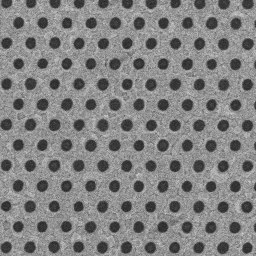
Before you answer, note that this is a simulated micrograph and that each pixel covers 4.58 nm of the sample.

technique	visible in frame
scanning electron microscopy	a regular array of holes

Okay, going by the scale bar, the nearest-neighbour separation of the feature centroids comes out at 107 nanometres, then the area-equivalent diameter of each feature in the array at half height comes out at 11.1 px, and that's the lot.